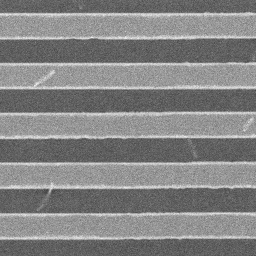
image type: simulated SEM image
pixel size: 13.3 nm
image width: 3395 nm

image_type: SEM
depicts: lines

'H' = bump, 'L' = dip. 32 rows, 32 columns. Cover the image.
LLLLLLLLLLLLLLLLLLLLLLLLLLLLLLLL
LLLLLLLLLLLLLLLLLLLLLLLLLLLLLLLL
HHHHHHHHHHHHHHHHHHHHHHHHHHHHHHHH
HHHHHHHHHHHHHHHHHHHHHHHHHHHHHHHH
HHHHHHHHHHHHHHHHHHHHHHHHHHHHHHHH
LLLLLLLLLLLLLLLLLLLLLLLLLLLLLLLL
LLLLLLLLLLLLLLLLLLLLLLLLLLLLLLLL
LLLLLLLLLLLLLLLLLLLLLLLLLLLLLLLL
HHHHHHHHHHHHHHHHHHHHHHHHHHHHHHHH
HHHHHHHHHHHHHHHHHHHHHHHHHHHHHHHH
HHHHHHHHHHHHHHHHHHHHHHHHHHHHHHHH
LLLLLLLLLLLLLLLLLLLLLLLLLLLLLLLL
LLLLLLLLLLLLLLLLLLLLLLLLLLLLLLLL
LLLLLLLLLLLLLLLLLLLLLLLLLLLLLLLL
HHHHHHHHHHHHHHHHHHHHHHHHHHHHHHHH
HHHHHHHHHHHHHHHHHHHHHHHHHHHHHHHH
HHHHHHHHHHHHHHHHHHHHHHHHHHHHHHHH
LLLLLLLLLLLLLLLLLLLLLLLLLLLLLLLL
LLLLLLLLLLLLLLLLLLLLLLLLLLLLLLLL
LLLLLLLLLLLLLLLLLLLLLLLLLLLLLLLL
HHHHHHHHHHHHHHHHHHHHHHHHHHHHHHHH
HHHHHHHHHHHHHHHHHHHHHHHHHHHHHHHH
HHHHHHHHHHHHHHHHHHHHHHHHHHHHHHHH
HHHHHHHHHHHHHHHHHHHHHLLLLLHHHLLH
LLLLLLLLLLLLLLLLLLLLLLLLLLLLLLLL
LLLLLLLLLLLLLLLLLLLLLLLLLLLLLLLL
LLLLLLLLLLLLLLLLLLLLLLLLLLLLLLLL
HHHHHHHHHHHHHHHHHHHHHHHHHHHHHHHH
HHHHHHHHHHHHHHHHHHHHHHHHHHHHHHHH
HHHHHHHHHHHHHHHHHHHHHHHHHHHHHHHH
LLLLLLLLLLLLLLLLLLLLLLLLLLLLLLLL
LLLLLLLLLLLLLLLLLLLLLLLLLLLLLLLL